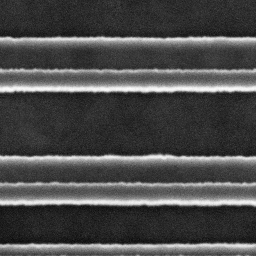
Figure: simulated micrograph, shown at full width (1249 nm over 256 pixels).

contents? lines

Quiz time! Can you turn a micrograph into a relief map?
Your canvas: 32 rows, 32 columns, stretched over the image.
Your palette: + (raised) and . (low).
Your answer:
................................
................................
................................
................................
................................
++++++++++++++++++++++++++++++++
++++++++++++++++++++++++++++++++
++++++++++++++++++++++++++++++++
++++++++++++++++++++++++++++++++
++++++++++++++++++++++++++++++++
++++++++++++++++++++++++++++++++
................................
................................
................................
................................
................................
................................
................................
................................
................................
++++++++++++++++++++++++++++++++
++++++++++++++++++++++++++++++++
++++++++++++++++++++++++++++++++
++++++++++++++++++++++++++++++++
++++++++++++++++++++++++++++++++
................................
................................
................................
................................
................................
................................
++++++++++++++++++++++++++++++++